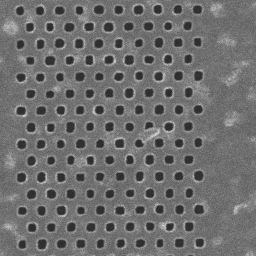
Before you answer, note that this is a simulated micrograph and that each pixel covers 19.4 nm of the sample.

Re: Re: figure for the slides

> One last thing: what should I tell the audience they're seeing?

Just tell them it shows a regular array of holes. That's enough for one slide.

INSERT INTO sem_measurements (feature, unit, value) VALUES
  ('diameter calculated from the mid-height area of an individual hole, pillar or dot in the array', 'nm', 182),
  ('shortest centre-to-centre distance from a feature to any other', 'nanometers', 368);